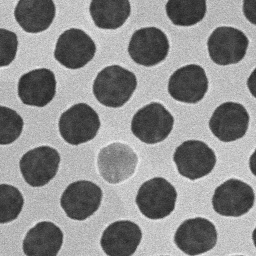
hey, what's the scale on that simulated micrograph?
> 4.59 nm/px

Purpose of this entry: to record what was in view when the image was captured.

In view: a regular array of holes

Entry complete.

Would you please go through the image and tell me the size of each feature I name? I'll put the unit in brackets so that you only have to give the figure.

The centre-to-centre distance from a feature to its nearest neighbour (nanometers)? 244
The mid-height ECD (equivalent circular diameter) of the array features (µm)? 0.187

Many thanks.